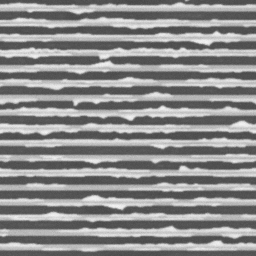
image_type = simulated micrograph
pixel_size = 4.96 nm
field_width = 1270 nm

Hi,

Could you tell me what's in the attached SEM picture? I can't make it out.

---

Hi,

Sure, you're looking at parallel lines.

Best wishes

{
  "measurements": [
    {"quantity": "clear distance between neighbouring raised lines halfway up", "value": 39.1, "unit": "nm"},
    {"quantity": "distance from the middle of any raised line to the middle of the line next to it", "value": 74.4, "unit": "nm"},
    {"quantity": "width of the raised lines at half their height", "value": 34.1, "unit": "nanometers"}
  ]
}